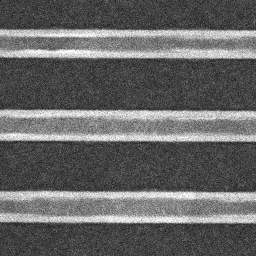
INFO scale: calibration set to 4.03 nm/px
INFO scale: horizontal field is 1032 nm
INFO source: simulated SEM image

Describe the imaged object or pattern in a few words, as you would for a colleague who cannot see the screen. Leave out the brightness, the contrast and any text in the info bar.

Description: one or a few lines or trenches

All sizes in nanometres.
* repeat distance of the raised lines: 329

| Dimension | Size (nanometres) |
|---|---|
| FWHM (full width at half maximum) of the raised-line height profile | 105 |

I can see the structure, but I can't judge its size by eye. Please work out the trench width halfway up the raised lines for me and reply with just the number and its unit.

0.227 um